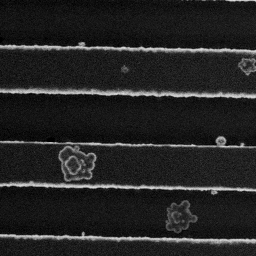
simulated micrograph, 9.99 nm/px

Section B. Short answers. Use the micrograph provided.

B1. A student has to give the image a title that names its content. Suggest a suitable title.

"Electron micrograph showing lines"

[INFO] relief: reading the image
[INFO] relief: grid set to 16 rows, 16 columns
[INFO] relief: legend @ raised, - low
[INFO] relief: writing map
----------------
----------------
----------------
@@@@@@@@@@@@@@@@
@@@@@@@@@@@@@@@@
@@@@@@@@@@@@@@@@
----------------
----------------
----------------
@@@@@@@@@@@@@@@@
@@@@@@@@@@@@@@@@
@@@@@@@@@@@@@@@@
----------------
----------------
----------------
@@@@@@@@@@@@@@@@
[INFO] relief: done